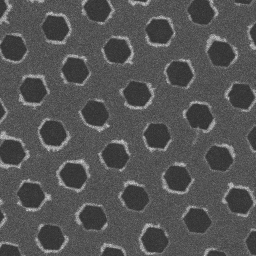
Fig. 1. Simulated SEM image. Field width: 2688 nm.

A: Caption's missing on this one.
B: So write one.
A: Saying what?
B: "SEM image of a regular array of holes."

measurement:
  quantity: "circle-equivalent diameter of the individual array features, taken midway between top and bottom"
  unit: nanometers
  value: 272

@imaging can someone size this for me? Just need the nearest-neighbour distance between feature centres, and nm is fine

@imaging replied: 486